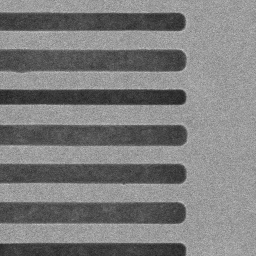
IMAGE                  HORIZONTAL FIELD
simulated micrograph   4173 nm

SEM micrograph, parallel lines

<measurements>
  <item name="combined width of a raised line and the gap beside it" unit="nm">629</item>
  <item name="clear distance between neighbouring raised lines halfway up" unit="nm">325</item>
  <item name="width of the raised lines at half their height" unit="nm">310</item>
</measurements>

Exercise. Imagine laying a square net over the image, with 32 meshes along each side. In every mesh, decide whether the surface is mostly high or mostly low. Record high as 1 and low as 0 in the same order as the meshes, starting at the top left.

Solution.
11111111111111111111111111111111
11111111111111111111111111111111
00000000000000000000000111111111
00000000000000000000000111111111
11111111111111111111111111111111
11111111111111111111111111111111
00000000000000000000000111111111
00000000000000000000000111111111
00000000000000000000000111111111
11111111111111111111111111111111
11111111111111111111111111111111
00000000000000000000000111111111
00000000000000000000000111111111
11111111111111111111111111111111
11111111111111111111111111111111
11111111111111111111111111111111
00000000000000000000000111111111
00000000000000000000000111111111
11111111111111111111111111111111
11111111111111111111111111111111
00000000000000000000001111111111
00000000000000000000000111111111
00000000000000000000000111111111
11111111111111111111111111111111
11111111111111111111111111111111
00000000000000000000000111111111
00000000000000000000000111111111
00000000000000000000000111111111
11111111111111111111111111111111
11111111111111111111111111111111
00000000000000000000000111111111
00000000000000000000000111111111